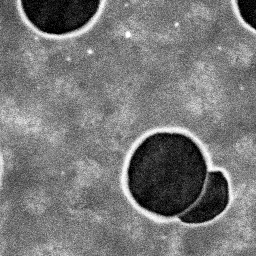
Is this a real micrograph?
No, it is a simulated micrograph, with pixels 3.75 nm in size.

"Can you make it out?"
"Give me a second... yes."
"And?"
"holes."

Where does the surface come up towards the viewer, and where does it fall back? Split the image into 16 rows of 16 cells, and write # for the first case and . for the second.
#.....#########.
##...##########.
################
################
################
################
################
################
#########...####
########.....###
########.....###
########......##
########......##
##########....##
################
################